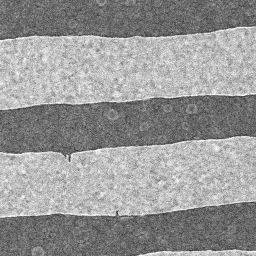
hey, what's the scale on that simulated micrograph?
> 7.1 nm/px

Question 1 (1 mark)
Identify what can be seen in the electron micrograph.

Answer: one or a few lines or trenches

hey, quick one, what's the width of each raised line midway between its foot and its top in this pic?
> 468 nanometers